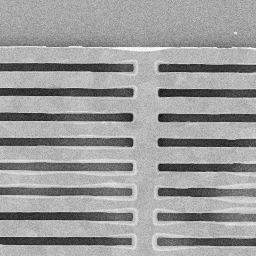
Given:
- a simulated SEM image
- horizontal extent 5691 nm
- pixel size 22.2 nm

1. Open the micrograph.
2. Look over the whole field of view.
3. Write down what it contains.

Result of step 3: groups of lines, slits or small figures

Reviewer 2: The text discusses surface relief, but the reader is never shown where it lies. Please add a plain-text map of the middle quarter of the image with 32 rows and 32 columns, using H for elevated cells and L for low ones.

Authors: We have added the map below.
LLLLLLLLLLLLLLLLLLHHHHHLLLLLLLLL
LLLLLLLLLLLLLLLLLLHHHHHLLLLLLLLL
HHHHHHHHHHHHHHLLLHHHHHHHHHHHHHHH
HHHHHHHHHHHHHHHHHHHHHHHHHHHHHHHH
HHHHHHHHHHHHHHHHHHHHHHHHHHHHHHHH
HHHHHHHHHHHHHHHHHHHHHHHHHHHHHHHH
LLLLLLLLLLLLLLLLLLHHHHHLLLLLLLLL
LLLLLLLLLLLLLLLLLLHHHHHLLLLLLLLL
HHHHHHHHHHHHHHHLLHHHHHHHHHHHHHHH
HHHHHHHHHHHHHHHHHHHHHHHHHHHHHHHH
HHHHHHHHHHHHHHHHHHHHHHHHHHHHHHHH
HHHHHHHHHHHHHHHHHHHHHHHHHHHHHHHH
LLLLLLLLLLLLLLLLLHHHHHHHLLLLLLLL
LLLLLLLLLLLLLLLLLLHHHHHLLLLLLLLL
LLLLLLLLLLLLLLLLLHHHHHHHLLLLLLLL
HHHHHHHHHHHHHHHHHHHHHHHHHHHHHHHH
HHHHHHHHHHHHHHHHHHHHHHHHHHHHHHHH
HHHHHHHHHHHHHHHHHHHHHHHHHHHHHHHH
LLLLLLLLLLLLLLLLLHHHHHHHLLLLHHHH
LLLLLLLLLLLLLLLLLLHHHHHLLLLLLLLL
LLLLLLLLLLLLLLLLLLHHHHHLLLLLLLLL
HHHHHHHHHHHHHHHHHHHHHHHHHHHHHHHH
HHHHHHHHHHHHHHHHHHHHHHHHHHHHHHHH
HHHHHHHHHHHHHHHHHHHHHHHHHHHHHHHH
LLLLLLLLLLLLLLLLLLHHHHHHHHHHHHHH
LLLLLLLLLLLLLLLLLLHHHHHLLLLLLLLL
LLLLLLLLLLLLLLLLLLHHHHHLLLLLLLLL
HHHHHHHHHLLLLHHHHHHHHHHHHHHHHHHH
HHHHHHHHHHHHHHHHHHHHHHHHHHHHHHHH
HHHHHHHHHHHHHHHHHHHHHHHHHHHHHHHH
HHHLLLLLLLLLLLLLLHHHHHHHHHHHHHHH
LLLLLLLLLLLLLLLLLLHHHHHLLLLLLLLL